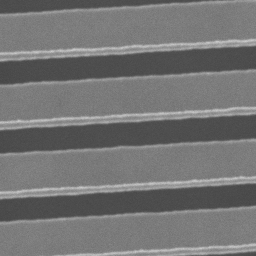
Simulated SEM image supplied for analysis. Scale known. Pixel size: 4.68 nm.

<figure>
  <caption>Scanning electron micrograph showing lines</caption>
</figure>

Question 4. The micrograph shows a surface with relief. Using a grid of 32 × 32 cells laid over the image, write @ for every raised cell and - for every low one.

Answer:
---------------------@@@@@@@@@@@
------@@@@@@@@@@@@@@@@@@@@@@@@@@
@@@@@@@@@@@@@@@@@@@@@@@@@@@@@@@@
@@@@@@@@@@@@@@@@@@@@@@@@@@@@@@@@
@@@@@@@@@@@@@@@@@@@@@@@@@@@@@@@@
@@@@@@@@@@@@@@@@@@@@@@@@@@@@@@@@
@@@@@@@@@@@@@@@@@@--------------
@-------------------------------
--------------------------------
---------------------@@@@@@@@@@@
---@@@@@@@@@@@@@@@@@@@@@@@@@@@@@
@@@@@@@@@@@@@@@@@@@@@@@@@@@@@@@@
@@@@@@@@@@@@@@@@@@@@@@@@@@@@@@@@
@@@@@@@@@@@@@@@@@@@@@@@@@@@@@@@@
@@@@@@@@@@@@@@@@@@@@@@@@@@@@----
@@@@@@@@@@@---------------------
--------------------------------
-------------------------------@
--------------@@@@@@@@@@@@@@@@@@
@@@@@@@@@@@@@@@@@@@@@@@@@@@@@@@@
@@@@@@@@@@@@@@@@@@@@@@@@@@@@@@@@
@@@@@@@@@@@@@@@@@@@@@@@@@@@@@@@@
@@@@@@@@@@@@@@@@@@@@@@@@@@@@@@@@
@@@@@@@@@@@@@@@@@@@@------------
@@@@@@--------------------------
--------------------------------
---------------------@@@@@@@@@@@
------@@@@@@@@@@@@@@@@@@@@@@@@@@
@@@@@@@@@@@@@@@@@@@@@@@@@@@@@@@@
@@@@@@@@@@@@@@@@@@@@@@@@@@@@@@@@
@@@@@@@@@@@@@@@@@@@@@@@@@@@@@@@@
@@@@@@@@@@@@@@@@@@@@@@@@@@@@@@--